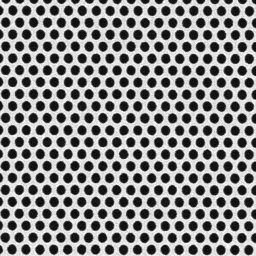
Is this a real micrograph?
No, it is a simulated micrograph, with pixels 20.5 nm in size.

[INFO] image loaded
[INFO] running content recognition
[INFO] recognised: a regular array of holes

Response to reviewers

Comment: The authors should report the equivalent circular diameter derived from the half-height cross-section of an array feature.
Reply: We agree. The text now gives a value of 205 nanometers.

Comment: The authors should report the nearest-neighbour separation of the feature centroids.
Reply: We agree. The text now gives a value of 280 nm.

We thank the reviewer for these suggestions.